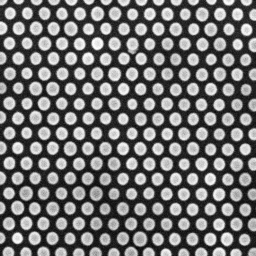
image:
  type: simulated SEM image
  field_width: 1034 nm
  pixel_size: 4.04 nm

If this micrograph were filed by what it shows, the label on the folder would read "a regular array of raised bodies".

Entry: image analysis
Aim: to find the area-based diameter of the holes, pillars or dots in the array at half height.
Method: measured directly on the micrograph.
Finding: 46.4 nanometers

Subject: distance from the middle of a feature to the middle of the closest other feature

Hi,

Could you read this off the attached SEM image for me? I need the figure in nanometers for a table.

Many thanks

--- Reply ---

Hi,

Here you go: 68.6